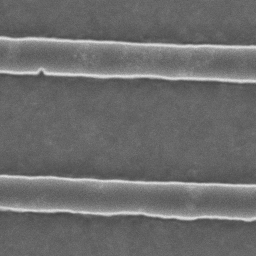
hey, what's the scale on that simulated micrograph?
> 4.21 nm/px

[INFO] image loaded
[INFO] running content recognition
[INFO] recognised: one or a few lines or trenches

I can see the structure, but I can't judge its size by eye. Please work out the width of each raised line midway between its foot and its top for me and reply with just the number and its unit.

145 nanometres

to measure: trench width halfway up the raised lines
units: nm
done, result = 437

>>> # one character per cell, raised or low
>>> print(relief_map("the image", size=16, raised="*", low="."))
................
................
****............
****************
****************
................
................
................
................
................
................
*************...
****************
..........******
................
................